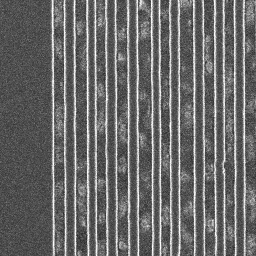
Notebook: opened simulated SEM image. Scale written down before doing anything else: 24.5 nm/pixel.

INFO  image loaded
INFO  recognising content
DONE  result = parallel lines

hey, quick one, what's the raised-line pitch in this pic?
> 519 nm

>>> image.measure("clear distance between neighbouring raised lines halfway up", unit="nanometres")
284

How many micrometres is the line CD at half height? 0.245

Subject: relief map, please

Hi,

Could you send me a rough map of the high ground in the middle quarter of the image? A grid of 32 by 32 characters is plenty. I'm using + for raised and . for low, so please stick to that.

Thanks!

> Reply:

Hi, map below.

+++...++...++...++....++...++...
+++...++...++...++....++...++...
+++...++...++...++....++...++...
+++...++...++...++....++...++...
+++...++...++...++....++...++...
+++...++...++...++....++...++...
+++...++...++...++....++...++...
+++...++...++...++....++...++...
+++...++...++...++....++...++...
+++...++...++...++....++...++...
+++...++...++...++....++...++...
+++...++...++...++....++...++...
+++...++...++...++....++...++...
+++...++...++...++....++...++...
+++...++...++...++....++...++...
+++...++...++...++....++...++...
+++...++...++...++....++...++...
+++...++...++...++....++...++...
+++...++...++...++....++...++...
+++...++...++...+++...++...++...
+++...++...++...+++...++...++...
+++...++...++...+++...++...++...
+++...++...++...+++...++...++...
+++...++...++...+++...++...++...
+++...++...++...+++...++...++...
+++...++...++...+++...++...++...
+++...++...++...+++...++...++...
+++...++...++...+++...++...++...
+++...++...++...+++...++...++...
+++...++...++...+++...++...++...
+++...++...++...+++...++...++...
+++...++...++...+++...++...++...